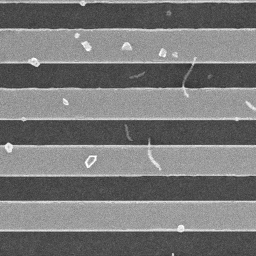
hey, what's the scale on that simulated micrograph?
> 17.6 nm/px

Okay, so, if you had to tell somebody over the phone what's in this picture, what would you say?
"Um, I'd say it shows lines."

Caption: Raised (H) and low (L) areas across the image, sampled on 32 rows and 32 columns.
LLLLLLLLLLHLLLLLLLLLLLLLLLLLLLLL
LLLLLLLLLLLLLLLLLLLLLLLLLLLLLLLL
LLLLLLLLLLLLLLLLLLLLLLLLLLLLLLLL
LLLLLLLLLLLLLLLLLLLLLLLLLLLLLLLL
HHHHHHHHHHHHHHHHHHHHHHHHHHHHHHHH
HHHHHHHHHHHHHHHHHHHHHHHHHHHHHHHH
HHHHHHHHHHHHHHHHHHHHHHHHHHHHHHHH
HHHHHHHHHHHHHHHHHHHHHHHHHHHHHHHH
LLLLLLLLLLLLLLLLLLLLLLLLLLLLLLLL
LLLLLLLLLLLLLLLLLLLLLLLLLLLLLLLL
LLLLLLLLLLLLLLLLLLLLLLLLLLLLLLLL
HHHHHHHHHHHHHHHHHHHHHHHHHHHHHHHH
HHHHHHHHHHHHHHHHHHHHHHHHHHHHHHHH
HHHHHHHHHHHHHHHHHHHHHHHHHHHHHHHH
HHHHHHHHHHHHHHHHHHHHHHHHHHHHHHHH
LLLLLLLLLLLLLLLLLLLLLLLLLLLLLLLL
LLLLLLLLLLLLLLLLLLLLLLLLLLLLLLLL
LLLLLLLLLLLLLLLLLLLLLLLLLLLLLLLL
HHHHHHHHHHHHHHHHHHHHHHHHHHHHHHHH
HHHHHHHHHHHHHHHHHHHHHHHHHHHHHHHH
HHHHHHHHHHHHHHHHHHHHHHHHHHHHHHHH
HHHHHHHHHHHHHHHHHHHHHHHHHHHHHHHH
LLLLLLLLLLLLLLLLLLLLLLLLLLLLLLLL
LLLLLLLLLLLLLLLLLLLLLLLLLLLLLLLL
LLLLLLLLLLLLLLLLLLLLLLLLLLLLLLLL
HHHHHHHHHHHHHHHHHHHHHHHHHHHHHHHH
HHHHHHHHHHHHHHHHHHHHHHHHHHHHHHHH
HHHHHHHHHHHHHHHHHHHHHHHHHHHHHHHH
HHHHHHHHHHHHHHHHHHHHHHHHHHHHHHHH
LLLLLLLLLLLLLLLLLLLLLLLLLLLLLLLL
LLLLLLLLLLLLLLLLLLLLLLLLLLLLLLLL
LLLLLLLLLLLLLLLLLLLLLLLLLLLLLLLL